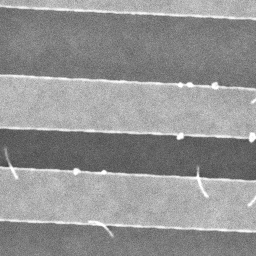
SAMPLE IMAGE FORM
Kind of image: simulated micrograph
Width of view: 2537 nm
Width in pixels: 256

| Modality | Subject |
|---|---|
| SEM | lines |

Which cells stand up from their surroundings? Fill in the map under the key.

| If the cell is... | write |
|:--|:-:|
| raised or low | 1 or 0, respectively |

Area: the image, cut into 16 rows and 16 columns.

0111111111111111
0000000000000000
0000000000000000
0000000000000000
0000000000000000
1111111111111111
1111111111111111
1111111111111111
0000000000011111
0000000000000000
1000000000000000
1111111111111111
1111111111111111
1111111111111111
0000000000000000
0000000000000000